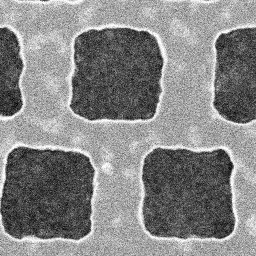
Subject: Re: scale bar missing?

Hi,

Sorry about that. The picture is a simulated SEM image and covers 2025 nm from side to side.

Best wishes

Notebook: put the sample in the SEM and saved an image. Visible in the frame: holes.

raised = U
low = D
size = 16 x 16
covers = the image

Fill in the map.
UUUUUUUUUUUUUUUU
UUUUUUUUUUUUUUUU
DUUUUDDDDDUUUUDD
DUUUUDDDDDUUUDDD
DUUUUDDDDDUUUDDD
DUUUDDDDDDUUUDDD
DUUUDDDDDDUUUDDD
UUUUUUUDUUUUUUDD
UUUUUUUUUUUUUUUU
UDDDDUUUUDDDDDUU
DDDDDDUUUDDDDDDU
DDDDDDUUUDDDDDUU
DDDDDDUUUDDDDDDU
DDDDDDUUUDDDDDDU
DDDDDDUUUDDDDDUU
UUUUUUUUUUUUUUUU